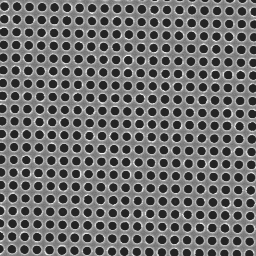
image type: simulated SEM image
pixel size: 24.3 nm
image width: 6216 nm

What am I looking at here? a regular array of holes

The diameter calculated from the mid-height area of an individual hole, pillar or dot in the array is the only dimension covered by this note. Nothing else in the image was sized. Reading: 209 nm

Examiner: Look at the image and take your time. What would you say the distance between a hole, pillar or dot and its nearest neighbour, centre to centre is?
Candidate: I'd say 300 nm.